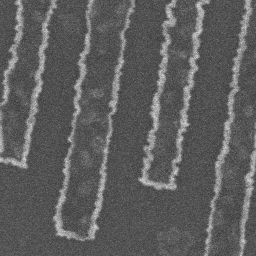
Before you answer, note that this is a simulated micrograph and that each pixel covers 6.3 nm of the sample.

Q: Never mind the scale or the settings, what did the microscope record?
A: one or a few lines or trenches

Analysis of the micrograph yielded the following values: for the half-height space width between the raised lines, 0.249 µm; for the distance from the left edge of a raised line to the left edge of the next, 473 nm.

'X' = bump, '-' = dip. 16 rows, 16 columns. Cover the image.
-XX---XX--XXX--X
-XX---XX--XXX--X
-XX--XXX--XX---X
-XX--XXX--XX---X
XXX--XX---XX---X
XXX--XX---XX---X
XX---XX---XX--XX
XX---XX---XX--XX
XX--XXX--XX---XX
XX--XXX--XX---XX
----XXX--XX---XX
----XX---XX---XX
----XX-------XXX
----XX-------XX-
----XX-------XX-
-------------XX-